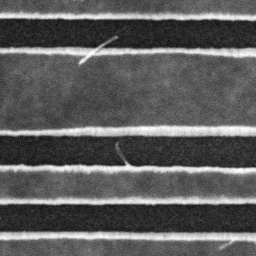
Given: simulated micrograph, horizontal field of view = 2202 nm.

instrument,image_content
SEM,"lines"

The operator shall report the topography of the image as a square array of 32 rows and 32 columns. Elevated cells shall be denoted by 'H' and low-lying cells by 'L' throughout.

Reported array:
HHHHHHHHHHHHHHHHHHHHHHHHHHHHHHHH
HHHHHHHHHHHHHHHHHHHHHHHHHHHHHHHH
LLLLLLLLLLLLLLLLLLLLLLLLLLLLLLLL
LLLLLLLLLLLLLLLLLLLLLLLLLLLLLLLL
LLLLLLLLLLLLLLLLLLLLLLLLLLLLLLLL
LLLLLLLLLLLLLLLLLLLLLLLLLLLLLLLL
HHHHHHHHHHHHHHHHHHHHHHHHHHHLLLLL
HHHHHHHHHHHHHHHHHHHHHHHHHHHHHHHH
HHHHHHHHHHHHHHHHHHHHHHHHHHHHHHHH
HHHHHHHHHHHHHHHHHHHHHHHHHHHHHHHH
HHHHHHHHHHHHHHHHHHHHHHHHHHHHHHHH
HHHHHHHHHHHHHHHHHHHHHHHHHHHHHHHH
HHHHHHHHHHHHHHHHHHHHHHHHHHHHHHHH
HHHHHHHHHHHHHHHHHHHHHHHHHHHHHHHH
HHHHHHHHHHHHHHHHHHHHHHHHHHHHHHHH
HHHHHHHHHHHHHHHHHHHHHHHHHHHHHHHH
HHHHHHHHHHHHHHHHLLLLLLLHHLLLLLHH
LLLLLLLLLLLLLLLLLLLLLLLLLLLLLLLL
LLLLLLLLLLLLLLLLLLLLLLLLLLLLLLLL
LLLLLLLLLLLLLLLLLLLLLLLLLLLLLLLL
LLLLLLLLLLLLLLLLLLLLLLLLLLLLLLLL
HHHHHHHHHHHHHHHHHHHHHHHHHHHHHHHH
HHHHHHHHHHHHHHHHHHHHHHHHHHHHHHHH
HHHHHHHHHHHHHHHHHHHHHHHHHHHHHHHH
HHHHHHHHHHHHHHHHHHHHHHHHHHHHHHHH
LLLLLLLLLLLHLLLLLLLLLLLLLLLLLLLL
LLLLLLLLLLLLLLLLLLLLLLLLLLLLLLLL
LLLLLLLLLLLLLLLLLLLLLLLLLLLLLLLL
LLLLLLLLLLLLLLLLLLLLLLLLLLLLLLLL
HHHHHHHHHHHHHHHHHHHHHHHLHHHHHHLL
HHHHHHHHHHHHHHHHHHHHHHHHHHHHHHHH
HHHHHHHHHHHHHHHHHHHHHHHHHHHHHHHH